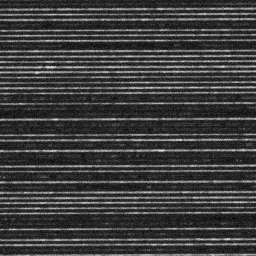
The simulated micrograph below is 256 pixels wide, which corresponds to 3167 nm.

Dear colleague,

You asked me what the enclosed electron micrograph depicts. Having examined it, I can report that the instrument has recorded parallel lines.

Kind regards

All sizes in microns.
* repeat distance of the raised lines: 0.0646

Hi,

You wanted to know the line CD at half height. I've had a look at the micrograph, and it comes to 1 px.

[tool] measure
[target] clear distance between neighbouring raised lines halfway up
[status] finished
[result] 49.5 nm